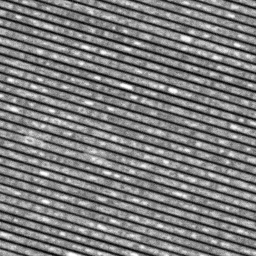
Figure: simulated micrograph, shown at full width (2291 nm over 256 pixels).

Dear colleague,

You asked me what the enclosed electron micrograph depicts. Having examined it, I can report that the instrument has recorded parallel lines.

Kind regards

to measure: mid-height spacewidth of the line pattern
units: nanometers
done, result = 22.5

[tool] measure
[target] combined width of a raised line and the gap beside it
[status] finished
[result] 79.4 nm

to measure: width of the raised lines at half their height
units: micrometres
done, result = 0.0612